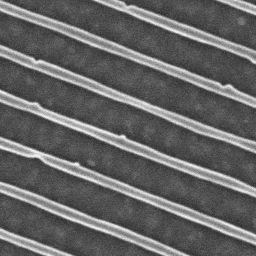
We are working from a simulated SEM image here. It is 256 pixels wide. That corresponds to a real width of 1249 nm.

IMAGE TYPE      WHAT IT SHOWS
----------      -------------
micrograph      parallel lines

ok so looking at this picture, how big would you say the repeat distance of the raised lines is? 208 nm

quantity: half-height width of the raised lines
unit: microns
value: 0.0444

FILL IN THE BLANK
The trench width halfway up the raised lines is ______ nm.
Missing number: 164